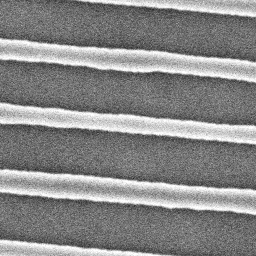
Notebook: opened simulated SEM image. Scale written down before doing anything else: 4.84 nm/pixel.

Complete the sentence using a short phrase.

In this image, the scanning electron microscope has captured lines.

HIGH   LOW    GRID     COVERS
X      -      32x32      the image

---------------XXXXXXXXXXXXXXXXX
--------------------------XXXXXX
--------------------------------
--------------------------------
--------------------------------
XXXXXX--------------------------
XXXXXXXXXXXXXXXXXXXX------------
--XXXXXXXXXXXXXXXXXXXXXXXXXXX---
------------XXXXXXXXXXXXXXXXXXXX
--------------------------XXXXXX
--------------------------------
--------------------------------
--------------------------------
XXXXX---------------------------
XXXXXXXXXXXXXXXXX---------------
---XXXXXXXXXXXXXXXXXXXXXXX------
----------------XXXXXXXXXXXXXXXX
---------------------------XXXXX
--------------------------------
--------------------------------
--------------------------------
XXXX----------------------------
XXXXXXXXXXXXXXX-----------------
XXXXXXXXXXXXXXXXXXXXXXXXXX------
------XXXXXXXXXXXXXXXXXXXXXXXXXX
------------------XXXXXXXXXXXXXX
-------------------------------X
--------------------------------
--------------------------------
--------------------------------
XXXXX---------------------------
XXXXXXXXXXXXXXX-----------------